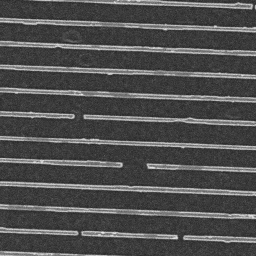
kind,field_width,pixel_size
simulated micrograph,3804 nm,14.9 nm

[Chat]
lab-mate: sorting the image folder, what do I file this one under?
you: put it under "parallel lines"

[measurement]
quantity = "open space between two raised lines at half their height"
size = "282 nm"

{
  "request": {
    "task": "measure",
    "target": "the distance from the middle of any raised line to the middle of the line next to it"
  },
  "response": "346 nm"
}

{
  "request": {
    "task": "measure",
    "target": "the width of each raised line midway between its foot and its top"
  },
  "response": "4.74 px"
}